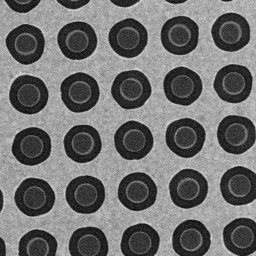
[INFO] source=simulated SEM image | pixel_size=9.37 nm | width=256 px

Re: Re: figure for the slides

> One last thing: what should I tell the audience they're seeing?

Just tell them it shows an array of small figures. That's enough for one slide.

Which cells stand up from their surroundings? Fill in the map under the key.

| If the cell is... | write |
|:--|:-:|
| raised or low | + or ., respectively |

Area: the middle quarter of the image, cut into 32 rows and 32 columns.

+++++++++++++++++++++++++++++.++
++++++++++++++++...++++++++.....
++....+++++++.......++++++......
........+++++........++++...+++.
....+...++++...++++..++++..+++++
..++++...+++..+++++...+++..+++++
.++++++..+++..+++++...+++..+++++
.++++++..+++...++++...+++...++++
..++++...+++...+++...+++++......
...++...+++++........++++++.....
........++++++.....+++++++++++.+
+.....++++++++++.+++++++++++++++
++++++++++++++++++++++++++++++++
++++++++++++++++++++++++++++++..
+++++++++++++++....++++++++.....
+++....+++++++.......+++++......
+.......+++++.........+++...++++
...+++...++++...++++..+++...++++
..+++++..+++...+++++..+++...++++
..+++++..+++...+++++...++...++++
..+++++..++++..+++++..++++...+++
...++++..++++...+++...+++++.....
....+....+++++.......+++++++....
+.......+++++++.....++++++++++..
+++...++++++++++++++++++++++++++
++++++++++++++++++++++++++++++++
+++++++++++++++++++++++++++++...
++++++++++++++++.....+++++++....
+++.....+++++++.......+++++.....
+.........++++....+....+++...+++
+...+++...++++..+++++..+++...+++
...+++++..+++...+++++..+++..++++